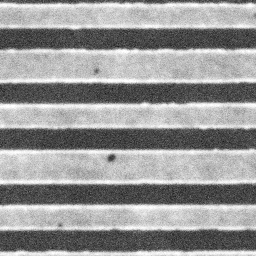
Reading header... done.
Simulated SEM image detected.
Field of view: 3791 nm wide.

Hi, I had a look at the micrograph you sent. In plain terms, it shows lines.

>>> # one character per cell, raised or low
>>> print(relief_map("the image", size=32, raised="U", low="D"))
DDDDDDDDDDDDDDDDDDDDDDDDDDDDDDDD
UUUUUUUUUUUUUUUUUUUUUUUUUUUUUUUU
UUUUUUUUUUUUUUUUUUUUUUUUUUUUUUUU
DDDDDDDDUUDDDDDDDDDDDDDDDDDDDDDD
DDDDDDDDDDDDDDDDDDDDDDDDDDDDDDDD
DDDDDDDDDDDDDDDDDDDDDDDDDDDDDDDD
UUUUUUUUUUUUUUUUUUUUUUUUUUUUUUUU
UUUUUUUUUUUUUUUUUUUUUUUUUUUUUUUU
UUUUUUUUUUUUUUUUUUUUUUUUUUUUUUUU
UUUUUUUUUUUUUUUUUUUUUUUUUUUUUUUU
DDDDDDDDDDDDDDDDDDDDDDDDDDDDDDDD
DDDDDDDDDDDDDDDDDDDDDDDDDDDDDDDD
DDDDDDDDDDDDDDDDDDDDDDDDDDDDDDDD
UUUUUUUUUUUUUUUUUUUUUUUUUUUUUUUU
UUUUUUUUUUUUUUUUUUUUUUUUUUUUUUUU
UUUUUUUUUUUUUUUUUUUUUUUUUUUUUUUU
DDDDDDDDDDDDDDDDDDDDDDDDDDDDDDDD
DDDDDDDDDDDDDDDDDDDDDDDDDDDDDDDD
DDDDDDDDDDDDDDDDDDDDDDDDDDDDDDDD
UUUUUUUUUUUUUUUUUUUUUUUUUUUUUUUU
UUUUUUUUUUUUUUUUUUUUUUUUUUUUUUUU
UUUUUUUUUUUUUUUUUUUUUUUUUUUUUUUU
UUUUUUUUUUUUUUUUUUUUUUUUUUUUUUUU
DDDDDDDDDDDDDDDDDDDDDDDDDDDDDDDD
DDDDDDDDDDDDDDDDDDDDDDDDDDDDDDDD
DDDDDDDDDDDDDDDDDDDDDDDDDDDDDDDD
UUUUUUUUUUUUUUUUUUUUUUUUUUUUUUUU
UUUUUUUUUUUUUUUUUUUUUUUUUUUUUUUU
UUUUUUUUUUUUUUUUUUUUUUUUUUUUUUUU
DDDDDDDDDDDDDDDDDDDDDDDDDDDDDDDD
DDDDDDDDDDDDDDDDDDDDDDDDDDDDDDDD
DDDDDDDDDDDDDDDDDDDDDDDDDDDDDDDD